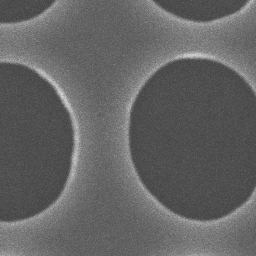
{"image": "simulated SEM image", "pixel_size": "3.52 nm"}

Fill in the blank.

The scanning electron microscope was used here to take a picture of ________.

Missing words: holes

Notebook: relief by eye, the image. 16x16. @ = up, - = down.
---@@@@@@@-----@
@@@@@@@@@@@@@@@@
@@@@@@@@@@@@@@@@
@@@@@@@@@@@@@@@@
--@@@@@@@@-----@
---@@@@@@-------
----@@@@--------
----@@@@--------
-----@@@--------
-----@@@--------
----@@@@--------
----@@@@@-------
----@@@@@@-----@
--@@@@@@@@@---@@
@@@@@@@@@@@@@@@@
@@@@@@@@@@@@@@@@